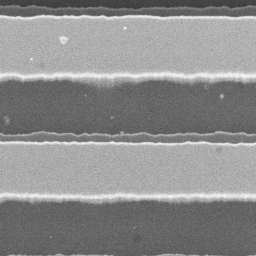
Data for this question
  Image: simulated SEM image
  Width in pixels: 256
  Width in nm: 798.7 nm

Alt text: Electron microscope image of lines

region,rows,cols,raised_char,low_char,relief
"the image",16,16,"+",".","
................
++++++++++++++++
++++++++++++++++
++++++++++++++++
++++++++++++++++
................
................
................
................
++++++++++++++++
++++++++++++++++
++++++++++++++++
................
................
................
................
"